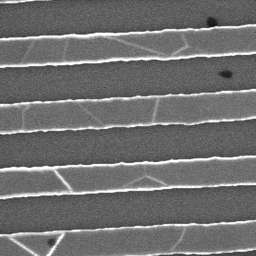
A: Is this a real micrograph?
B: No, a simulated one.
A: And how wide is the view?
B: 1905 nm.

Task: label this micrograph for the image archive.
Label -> lines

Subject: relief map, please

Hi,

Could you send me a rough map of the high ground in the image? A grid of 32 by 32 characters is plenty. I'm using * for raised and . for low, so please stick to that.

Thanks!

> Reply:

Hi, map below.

................................
................................
................................
..........................******
........************************
********************************
********************************
***************.................
................................
................................
................................
............................****
.............*******************
********************************
********************************
*********************..*........
**..............................
................................
................................
................................
..............******************
********************************
********************************
**********************..........
***.............................
................................
................................
................................
...............*****************
********************************
********************************
****************************....